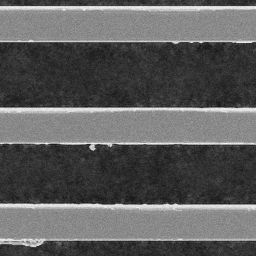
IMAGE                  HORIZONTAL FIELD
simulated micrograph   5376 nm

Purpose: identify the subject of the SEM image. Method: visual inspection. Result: lines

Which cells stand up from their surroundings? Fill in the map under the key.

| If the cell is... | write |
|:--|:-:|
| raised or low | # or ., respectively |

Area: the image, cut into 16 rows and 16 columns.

################
################
################
................
................
................
................
################
################
................
................
................
................
################
################
................